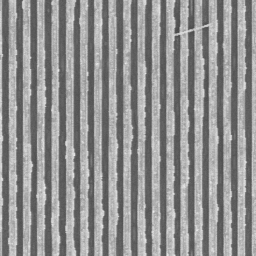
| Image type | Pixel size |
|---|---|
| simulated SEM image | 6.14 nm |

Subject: parallel lines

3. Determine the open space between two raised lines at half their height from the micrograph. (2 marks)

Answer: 7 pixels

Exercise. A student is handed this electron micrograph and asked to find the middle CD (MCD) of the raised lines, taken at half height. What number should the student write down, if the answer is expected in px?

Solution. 7.13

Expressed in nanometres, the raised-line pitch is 88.